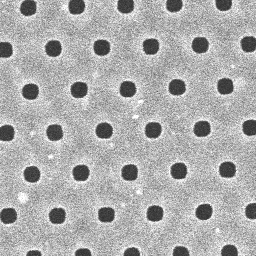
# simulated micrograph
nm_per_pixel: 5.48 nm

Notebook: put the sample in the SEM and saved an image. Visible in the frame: a regular array of holes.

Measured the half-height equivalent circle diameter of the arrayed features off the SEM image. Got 97.1 nm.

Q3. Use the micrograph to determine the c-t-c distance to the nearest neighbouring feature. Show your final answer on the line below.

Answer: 264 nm